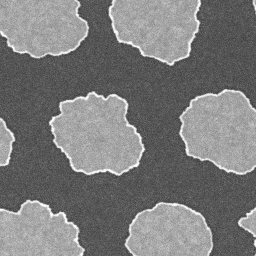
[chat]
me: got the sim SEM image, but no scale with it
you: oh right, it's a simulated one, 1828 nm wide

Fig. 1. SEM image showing raised bodies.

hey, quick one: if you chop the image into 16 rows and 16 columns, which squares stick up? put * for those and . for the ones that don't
*****..*****....
*****..*****....
*****...****....
..*......***....
................
................
....****....****
...*****...*****
*..******..*****
*...*****...****
.....***......**
................
................
****.....****..*
*****...*****...
*****...*****...